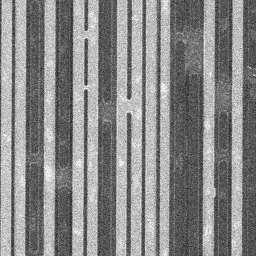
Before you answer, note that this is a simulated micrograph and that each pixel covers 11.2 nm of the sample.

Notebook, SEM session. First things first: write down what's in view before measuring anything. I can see parallel lines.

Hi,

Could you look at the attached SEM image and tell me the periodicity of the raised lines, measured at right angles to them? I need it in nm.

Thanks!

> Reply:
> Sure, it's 162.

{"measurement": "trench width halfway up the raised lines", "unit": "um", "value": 0.0519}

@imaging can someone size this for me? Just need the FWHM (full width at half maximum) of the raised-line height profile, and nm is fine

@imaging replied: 105